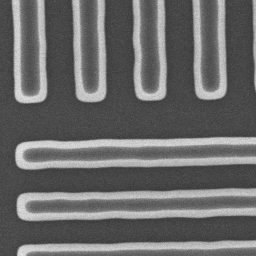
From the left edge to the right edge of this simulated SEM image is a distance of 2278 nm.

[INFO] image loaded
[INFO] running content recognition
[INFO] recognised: groups of lines, slits or small figures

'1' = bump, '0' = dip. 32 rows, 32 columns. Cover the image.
00111000011110000111000011110000
00111000011110000111000001110000
00111000001110000111000001110000
00111000001110000111000001110000
00111000001110000111000001110000
00111000001110000111000001110000
00111000001110000111000001110000
00111000001110000111000001110000
00111000001110000111000001110000
00111000001110000111000001110000
00111000001110000111000001110000
00111000001110000111000001110000
00010000000000000000000000000000
00000000000000000000000000000000
00000000000000000000000000000000
00000000000000000000000000000000
00000000000000000000000000000000
00000000000000000000000000000000
00011111111111111111111111111111
00111111111111111111111111111111
00011111111100000000000000000000
00000000000000000000000000000000
00000000000000000000000000000000
00000000000000000000000000000000
00000011101111111111111111111111
00011111111111111111111111111111
00011111111111111111111111111100
00000000000000000000000000000000
00000000000000000000000000000000
00000000000000000000000000000000
00000000000000000000000000000011
00011111111111111111111111111111